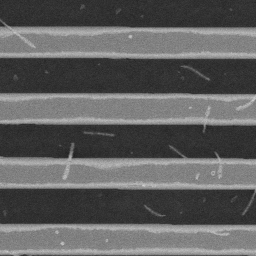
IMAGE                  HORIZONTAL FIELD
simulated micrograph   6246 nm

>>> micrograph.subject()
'lines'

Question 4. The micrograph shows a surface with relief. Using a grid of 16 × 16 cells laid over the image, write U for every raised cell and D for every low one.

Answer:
DDDDDDDDDDDDDDDD
DDDDDDDDDDDDDDDD
UUUUUUUUUUUUUUUU
UUUUUUUUUUUUUUUU
DDDDDDDDDDDDDDDD
DDDDDDDDDDDDDDDD
UUUUUUUUUUUUUUUU
UUUUUUUUUUUUUUUU
DDDDDDDDDDDDDDDD
DDDDDDDDDDDDDDDD
UUUUUUUUUUUUUUUU
UUUUUUUUUUUUUUUU
DDDDDDDDDDDDDDDD
DDDDDDDDDDDDDDDD
UUUUUUUUUUUUUUUU
UUUUUUUUUUUUUUUU